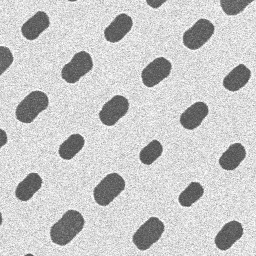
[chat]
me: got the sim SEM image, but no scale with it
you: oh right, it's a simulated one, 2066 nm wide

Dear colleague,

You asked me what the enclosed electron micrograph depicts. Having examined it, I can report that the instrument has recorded a regular array of holes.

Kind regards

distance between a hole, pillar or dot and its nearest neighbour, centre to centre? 454 nanometres